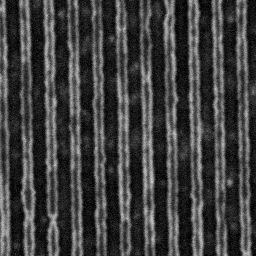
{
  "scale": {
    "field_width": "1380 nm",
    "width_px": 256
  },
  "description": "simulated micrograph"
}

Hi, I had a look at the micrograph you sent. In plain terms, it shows parallel lines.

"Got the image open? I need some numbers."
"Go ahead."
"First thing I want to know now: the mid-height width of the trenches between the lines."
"85.5 nm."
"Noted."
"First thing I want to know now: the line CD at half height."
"45.1 nm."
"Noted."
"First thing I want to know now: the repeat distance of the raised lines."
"24 px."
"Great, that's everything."